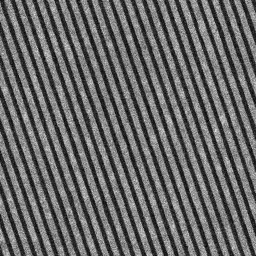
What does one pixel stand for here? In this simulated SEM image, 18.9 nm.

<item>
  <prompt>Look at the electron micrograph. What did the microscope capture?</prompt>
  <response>parallel lines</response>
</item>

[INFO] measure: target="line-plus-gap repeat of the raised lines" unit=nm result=196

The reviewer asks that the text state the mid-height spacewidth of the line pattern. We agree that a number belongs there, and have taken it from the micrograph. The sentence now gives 82.7 nm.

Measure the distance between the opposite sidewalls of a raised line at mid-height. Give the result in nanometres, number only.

114